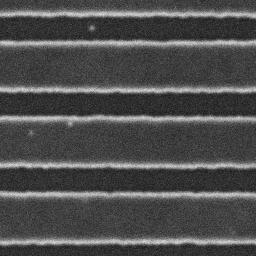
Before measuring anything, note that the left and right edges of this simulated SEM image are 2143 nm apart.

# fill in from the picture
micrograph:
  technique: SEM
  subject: lines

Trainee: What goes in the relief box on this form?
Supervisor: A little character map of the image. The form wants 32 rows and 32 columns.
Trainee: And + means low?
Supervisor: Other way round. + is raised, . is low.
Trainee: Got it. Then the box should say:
++++++++++++++++++++++++++++++++
++++++++++++++++++++++++++++++++
................................
................................
................................
++++++++++++++++++++++++++++++++
++++++++++++++++++++++++++++++++
++++++++++++++++++++++++++++++++
++++++++++++++++++++++++++++++++
++++++++++++++++++++++++++++++++
++++++++++++++++++++++++++++++++
.+..+.++++++++++++++++++++++.++.
................................
................................
............+...................
++++++++++++++++++++++++++++++++
++++++++++++++++++++++++++++++++
++++++++++++++++++++++++++++++++
++++++++++++++++++++++++++++++++
++++++++++++++++++++++++++++++++
++++++++++++++++++++++++++++++++
................................
................................
................................
++++++++++++++++++++++++++++++++
++++++++++++++++++++++++++++++++
++++++++++++++++++++++++++++++++
++++++++++++++++++++++++++++++++
++++++++++++++++++++++++++++++++
++++++++++++++++++++++++++++++++
++++.+...+.+...++.++.....+.+....
................................